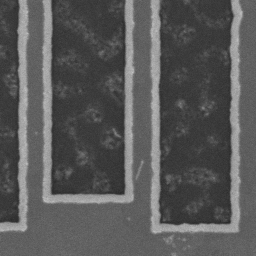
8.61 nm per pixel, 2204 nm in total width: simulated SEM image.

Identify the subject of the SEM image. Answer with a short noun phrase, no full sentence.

one or a few lines or trenches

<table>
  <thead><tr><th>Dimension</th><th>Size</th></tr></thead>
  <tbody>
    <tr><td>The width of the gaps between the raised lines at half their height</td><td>698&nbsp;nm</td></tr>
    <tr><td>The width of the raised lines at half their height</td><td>0.215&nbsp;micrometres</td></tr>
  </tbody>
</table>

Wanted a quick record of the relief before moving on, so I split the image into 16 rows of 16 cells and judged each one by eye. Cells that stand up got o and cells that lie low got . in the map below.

.oo.....oo.....o
.oo.....oo.....o
.oo.....oo.....o
.oo.....oo.....o
.oo.....oo.....o
.oo.....oo.....o
.oo.....oo.....o
.oo.....oo.....o
.oo.....oo.....o
.oo.....oo.....o
.oo.....oo.....o
.oo.....oo.....o
.ooooooooo.....o
.ooooooooo.....o
oooooooooooooooo
oooooooooooooooo